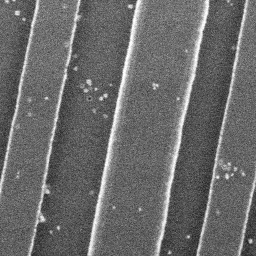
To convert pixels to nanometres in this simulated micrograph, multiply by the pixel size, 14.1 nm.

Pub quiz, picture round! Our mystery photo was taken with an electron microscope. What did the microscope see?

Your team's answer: lines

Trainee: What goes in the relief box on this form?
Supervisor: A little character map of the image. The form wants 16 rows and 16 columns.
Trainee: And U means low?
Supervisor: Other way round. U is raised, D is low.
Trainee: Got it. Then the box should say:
DDUUUDDDDUUUUDDU
DDUUUDDDUUUUUDDU
DDUUUDDDUUUUUDDU
DDUUDDDDUUUUDDDU
DUUUDDDDUUUUDDDU
DUUUDDDDUUUUDDUU
DUUUDDDUUUUUDDUU
DUUUDDDUUUUDDDUU
DUUDDDDUUUUDDDUU
UUUDDDDUUUUDDDUU
UUUDDDDUUUUDDUUU
UUUDDDUUUUUDDUUU
UUUDDDUUUUDDDUUU
UUDDDDUUUUDDDUUD
UUDDDDUUUUDDDUUD
UUDDDDUUUUDDUUUD